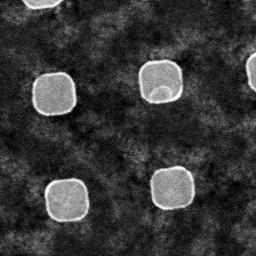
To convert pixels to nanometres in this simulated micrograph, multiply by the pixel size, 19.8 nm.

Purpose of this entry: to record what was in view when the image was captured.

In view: raised bodies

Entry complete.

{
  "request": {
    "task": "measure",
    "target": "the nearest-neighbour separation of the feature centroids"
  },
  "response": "2100 nanometers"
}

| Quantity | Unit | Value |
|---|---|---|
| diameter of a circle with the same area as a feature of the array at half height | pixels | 43.5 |